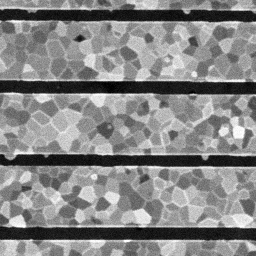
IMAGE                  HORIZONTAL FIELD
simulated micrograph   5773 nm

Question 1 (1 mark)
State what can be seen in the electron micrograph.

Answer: lines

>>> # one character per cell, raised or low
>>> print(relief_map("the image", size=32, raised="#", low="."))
################################
................................
................................
################################
################################
################################
################################
################################
################################
################################
................................
................................
################################
################################
################################
################################
################################
################################
################################
.#.......................#......
................................
################################
################################
################################
################################
################################
################################
################################
................................
................................
################################
################################